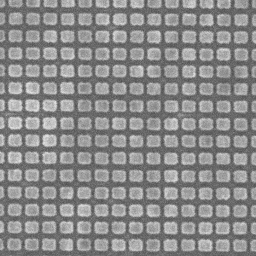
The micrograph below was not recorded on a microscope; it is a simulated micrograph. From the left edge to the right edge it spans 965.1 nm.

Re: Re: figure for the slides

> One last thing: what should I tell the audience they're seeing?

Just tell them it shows a regular array of raised bodies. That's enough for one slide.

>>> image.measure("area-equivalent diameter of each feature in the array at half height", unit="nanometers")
48.5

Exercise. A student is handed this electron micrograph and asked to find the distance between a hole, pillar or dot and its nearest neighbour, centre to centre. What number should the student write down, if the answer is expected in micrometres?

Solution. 0.0646